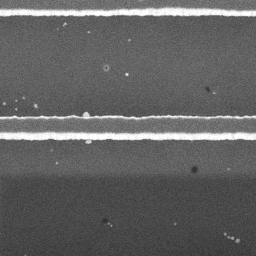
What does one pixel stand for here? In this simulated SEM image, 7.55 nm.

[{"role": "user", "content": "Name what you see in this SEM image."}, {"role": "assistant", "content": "lines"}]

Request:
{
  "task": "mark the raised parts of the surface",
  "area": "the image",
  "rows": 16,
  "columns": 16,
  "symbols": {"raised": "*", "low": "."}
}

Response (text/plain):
****************
................
................
................
................
................
................
****************
****************
................
................
................
................
................
................
................